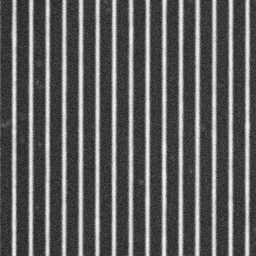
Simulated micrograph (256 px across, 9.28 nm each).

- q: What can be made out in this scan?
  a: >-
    parallel lines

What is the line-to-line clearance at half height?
137 nm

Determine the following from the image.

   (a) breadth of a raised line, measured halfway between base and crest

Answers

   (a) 0.0244 um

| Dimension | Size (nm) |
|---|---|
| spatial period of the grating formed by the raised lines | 154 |